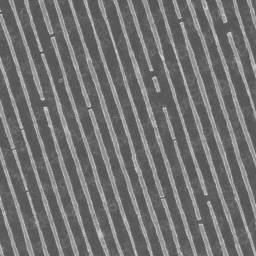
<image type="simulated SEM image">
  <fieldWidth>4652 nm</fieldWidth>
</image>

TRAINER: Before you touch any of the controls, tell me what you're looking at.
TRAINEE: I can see parallel lines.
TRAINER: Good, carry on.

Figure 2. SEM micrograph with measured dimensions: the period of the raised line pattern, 257 nm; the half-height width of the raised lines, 58.4 nm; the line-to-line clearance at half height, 195 nanometres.